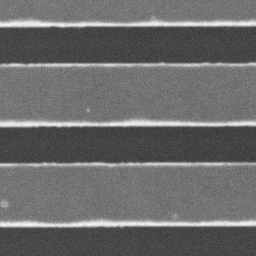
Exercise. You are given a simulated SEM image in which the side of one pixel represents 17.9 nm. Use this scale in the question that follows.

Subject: lines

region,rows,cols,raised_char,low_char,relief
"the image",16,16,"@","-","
@@@@@@@@@@@@@@@@
@@@@@@@@@@@@@@@@
----------------
----------------
@@@@@@@@@@@@@@@@
@@@@@@@@@@@@@@@@
@@@@@@@@@@@@@@@@
@@@@@@@@@@@@@@@@
----------------
----------------
@@@@@@@@@@@@@@@@
@@@@@@@@@@@@@@@@
@@@@@@@@@@@@@@@@
@@@@@@@@@@@@@@@@
----------------
----------------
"